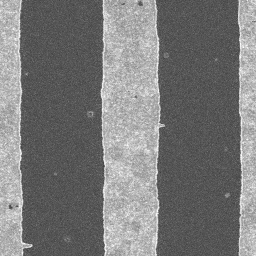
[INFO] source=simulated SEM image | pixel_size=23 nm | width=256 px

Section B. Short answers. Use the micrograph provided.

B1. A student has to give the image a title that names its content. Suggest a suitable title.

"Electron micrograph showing one or a few lines or trenches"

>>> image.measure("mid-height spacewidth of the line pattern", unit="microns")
1.91